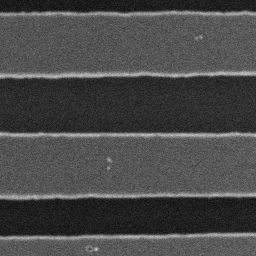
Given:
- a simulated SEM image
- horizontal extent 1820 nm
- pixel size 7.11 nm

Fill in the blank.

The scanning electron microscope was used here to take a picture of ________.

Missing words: lines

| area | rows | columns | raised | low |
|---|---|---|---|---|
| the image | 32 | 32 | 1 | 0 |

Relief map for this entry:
00000000000000000000000000000000
00000000000000000000010000000000
11111111111111111111111111111111
11111111111111111111111111111111
11111111111111111111111111111111
11111111111111111111111111111111
11111111111111111111111111111111
11111111111111111111111111111111
11111111111111111111111111111111
11111111111110000000011000000000
00000000000000000000000000000000
00000000000000000000000000000000
00000000000000000000000000000000
00000000000000000000000000000000
00000000000000000000000000000000
00000000000000000000000000000000
00000000000000000000000000000000
11111111111111111111111111111111
11111111111111111111111111111111
11111111111111111111111111111111
11111111111111111111111111111111
11111111111111111111111111111111
11111111111111111111111111111111
11111111111111111111111111111111
11111111111111111111111111111111
00000000000000000000000000000000
00000000000000000000000000000000
00000000000000000000000000000000
00000000000000000000000000000000
00000000000000101110111111111111
11111111111111111111111111111111
11111111111111111111111111111111